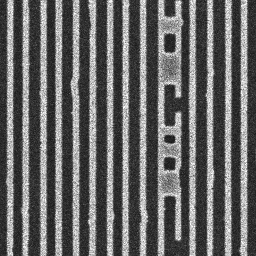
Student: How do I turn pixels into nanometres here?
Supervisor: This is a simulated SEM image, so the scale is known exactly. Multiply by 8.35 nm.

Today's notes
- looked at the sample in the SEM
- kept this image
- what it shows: parallel lines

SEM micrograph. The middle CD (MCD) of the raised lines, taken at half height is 0.0532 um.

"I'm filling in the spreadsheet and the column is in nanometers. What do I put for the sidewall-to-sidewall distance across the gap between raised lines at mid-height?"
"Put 91.9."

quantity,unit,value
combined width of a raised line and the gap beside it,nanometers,140